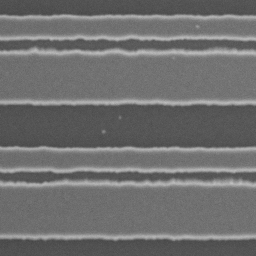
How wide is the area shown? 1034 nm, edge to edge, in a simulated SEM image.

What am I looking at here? lines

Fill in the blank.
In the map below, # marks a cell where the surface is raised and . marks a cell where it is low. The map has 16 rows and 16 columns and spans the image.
................
################
################
################
################
################
..#.#.....##..#.
................
................
################
################
################
################
################
################
................